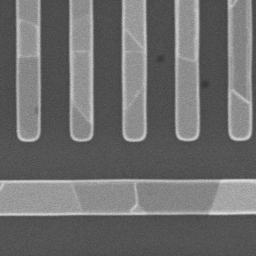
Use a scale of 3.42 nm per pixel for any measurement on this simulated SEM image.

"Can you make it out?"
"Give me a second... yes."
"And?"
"groups of lines, slits or small figures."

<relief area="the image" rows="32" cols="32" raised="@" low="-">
--@@@----@@----@@@----@@@----@@-
--@@@----@@----@@@----@@@----@@-
--@@@----@@----@@@----@@@----@@-
--@@@----@@----@@@----@@@----@@-
--@@@----@@----@@@----@@@----@@-
--@@@----@@----@@@----@@@----@@-
--@@@----@@----@@@----@@@----@@-
--@@@----@@----@@@----@@@----@@-
--@@@----@@----@@@----@@@----@@-
--@@@----@@----@@@----@@@----@@-
--@@@----@@----@@@----@@@----@@-
--@@@----@@----@@@----@@@----@@-
--@@@----@@----@@@----@@@----@@-
--@@@----@@@---@@@----@@@----@@-
--@@@----@@@---@@@----@@@----@@-
--@@@----@@@---@@@----@@@----@@-
--@@@----@@@---@@@----@@@----@@-
---@------@-----@---------------
--------------------------------
--------------------------------
--------------------------------
--------------------------------
--------------------------------
@@@@@@@@@@@@@@@@@@@@@@@@@@@@@@@@
@@@@@@@@@@@@@@@@@@@@@@@@@@@@@@@@
@@@@@@@@@@@@@@@@@@@@@@@@@@@@@@@@
@@@@@@@@@@@@@@@@@@@@@@@@@@@@@@@@
--------------------------------
--------------------------------
--------------------------------
--------------------------------
--------------------------------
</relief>